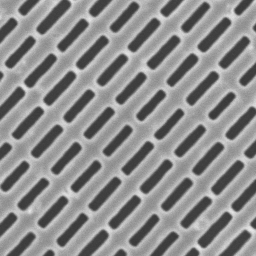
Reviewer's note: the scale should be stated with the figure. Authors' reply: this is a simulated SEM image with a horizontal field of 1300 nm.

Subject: a regular array of holes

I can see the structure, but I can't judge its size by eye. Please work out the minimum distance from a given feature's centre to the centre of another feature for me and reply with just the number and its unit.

0.133 micrometres